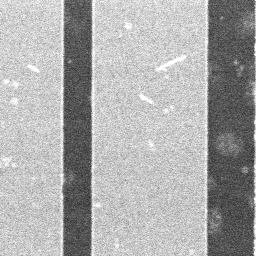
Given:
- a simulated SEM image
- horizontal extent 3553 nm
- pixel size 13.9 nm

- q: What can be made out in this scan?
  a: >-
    one or a few lines or trenches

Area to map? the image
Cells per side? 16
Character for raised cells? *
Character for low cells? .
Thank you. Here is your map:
****..*******...
****..*******...
****..*******...
****..*******...
****..*******...
****..*******...
****..*******...
****..*******...
****..*******...
****..*******...
****..*******...
****..*******...
****..*******...
****..*******...
****..*******...
****..*******...